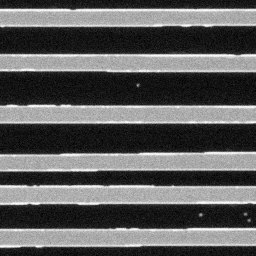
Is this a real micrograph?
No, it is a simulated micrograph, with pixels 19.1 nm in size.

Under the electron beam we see lines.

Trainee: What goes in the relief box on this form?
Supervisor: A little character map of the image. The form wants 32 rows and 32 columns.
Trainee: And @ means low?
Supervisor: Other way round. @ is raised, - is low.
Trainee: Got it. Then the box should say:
--------------------------------
@@@@@@@@@@@@@@@@@@@@@@@@@@@@@@@@
@@@@@@@@@@@@@@@@@@@@@@@@@@@@@@@@
--------------------------------
--------------------------------
--------------------------------
--------------------------------
@@@@@@@@@@@@@@@@@@@@@@@@@@@@@@@@
@@@@@@@@@@@@@@@@@@@@@@@@@@@@@@@@
--------------------------------
--------------------------------
--------------------------------
--------------------------------
@@@@@@@@@@@@@@@@@@@@@@@@@@@@@@@@
@@@@@@@@@@@@@@@@@@@@@@@@@@@@@@@@
--------------------------------
--------------------------------
--------------------------------
--------------------------------
@@@@@@@@@@@@@@@@@@@@@@@@@@@@@@@@
@@@@@@@@@@@@@@@@@@@@@@@@@@@@@@@@
--------------------------------
--------------------------------
@@@@@@@@@@@@@@@@@@@@@@@@@@@@@@@@
@@@@@@@@@@@@@@@@@@@@@@@@@@@@@@@@
--------------------------------
--------------------------------
--------------------------------
--------------------------------
@@@@@@@@@@@@@@@@@@@@@@@@@@@@@@@@
@@@@@@@@@@@@@@@@@@@@@@@@@@@@@@@@
--------------------------------